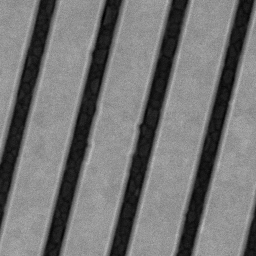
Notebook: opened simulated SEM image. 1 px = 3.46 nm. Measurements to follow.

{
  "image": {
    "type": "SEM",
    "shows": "one or a few lines or trenches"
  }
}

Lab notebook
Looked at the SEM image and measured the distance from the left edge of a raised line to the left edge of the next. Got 223 nm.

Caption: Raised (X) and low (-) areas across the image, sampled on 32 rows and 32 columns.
XXXXX--XXXXXX--XXXXXX---XXXXXX--
XXXX---XXXXXX--XXXXXX--XXXXXX---
XXXX---XXXXX---XXXXXX--XXXXXX--X
XXXX---XXXXX---XXXXX---XXXXXX--X
XXXX--XXXXXX---XXXXX---XXXXX---X
XXX---XXXXXX--XXXXXX--XXXXXX---X
XXX---XXXXX---XXXXXX--XXXXXX---X
XXX---XXXXX---XXXXX---XXXXXX--XX
XXX--XXXXXX--XXXXXX---XXXXXX--XX
XX---XXXXXX--XXXXXX--XXXXXX---XX
XX---XXXXX---XXXXXX--XXXXXX---XX
XX---XXXXX---XXXXX---XXXXXX--XXX
XX--XXXXXX--XXXXXX---XXXXXX--XXX
X---XXXXXX--XXXXXX---XXXXX---XXX
X---XXXXX---XXXXXX--XXXXXX---XXX
X--XXXXXX---XXXXX---XXXXXX--XXXX
X--XXXXXX---XXXXX---XXXXX---XXXX
---XXXXXX--XXXXXX---XXXXX---XXXX
---XXXXX---XXXXXX--XXXXXX---XXXX
--XXXXXX---XXXXX---XXXXXX--XXXXX
--XXXXXX---XXXXX---XXXXXX--XXXXX
--XXXXXX--XXXXXX---XXXXX---XXXXX
--XXXXX---XXXXXX--XXXXXX---XXXXX
--XXXXX---XXXXX---XXXXXX--XXXXXX
-XXXXXX---XXXXX---XXXXXX--XXXXXX
-XXXXXX--XXXXXX---XXXXX---XXXXXX
-XXXXX---XXXXXX--XXXXXX---XXXXX-
-XXXXX---XXXXX---XXXXXX--XXXXXX-
XXXXXX---XXXXX---XXXXXX--XXXXXX-
XXXXXX--XXXXXX---XXXXX---XXXXXX-
XXXXX---XXXXXX--XXXXXX--XXXXXX--
XXXXX---XXXXX---XXXXXX--XXXXXX--